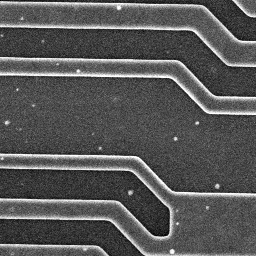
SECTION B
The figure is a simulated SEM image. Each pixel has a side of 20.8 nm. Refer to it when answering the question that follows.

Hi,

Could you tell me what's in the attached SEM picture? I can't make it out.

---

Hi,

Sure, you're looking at groups of lines, slits or small figures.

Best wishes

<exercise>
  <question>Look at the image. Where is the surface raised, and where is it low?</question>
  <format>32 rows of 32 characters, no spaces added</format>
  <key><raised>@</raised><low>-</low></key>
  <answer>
@@@@@@@@@@@@@@@--------------@@@
@@@@@@@@@@@@@@@@@@@@@@@@@@----@@
@@@@@@@@@@@@@@@@@@@@@@@@@@@-----
---------@@@@@@@@@@@@@@@@@@@----
-------------------------@@@@---
--------------------------@@@@@@
---------------------------@@@@@
@@@@@@@@@@@@@@@@@@----------@@@@
@@@@@@@@@@@@@@@@@@@@@@@---------
------------@@@@@@@@@@@@--------
----------------------@@@-------
-----------------------@@@------
------------------------@@@@@@@@
-------------------------@@@@@@@
--------------------------------
--------------------------------
--------------------------------
--------------------------------
--------------------------------
@@@@@@@@@@@@--------------------
@@@@@@@@@@@@@@@@@@--------------
----------------@@@-------------
------------------@@------------
-------------------@@-----------
--------------------@@@@@@@@@@@@
@@@@@@@@@@@@@@@------@@@@@@@@@@@
@@@@@@@@@@@@@@@@-----@@@@@@@@@@@
-------------@@@@----@@@@@@@@@@@
---------------@@@---@@@@@@@@@@@
----------------@@@--@@@@@@@@@@@
-----------------@@@@@@@@@@@@@@@
@@@@@@@@@@@@@-----@@@@@@@@@@@@@@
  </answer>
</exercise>